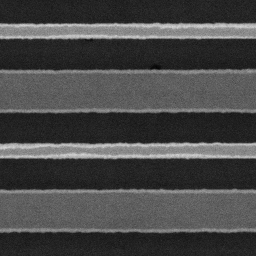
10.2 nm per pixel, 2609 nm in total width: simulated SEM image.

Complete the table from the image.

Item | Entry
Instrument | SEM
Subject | lines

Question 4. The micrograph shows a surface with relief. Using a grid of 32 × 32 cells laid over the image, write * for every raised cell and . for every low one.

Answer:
................................
................................
................................
********************************
********************************
................................
................................
................................
................................
********************************
********************************
********************************
********************************
********************************
................................
................................
................................
................................
********************************
********************************
................................
................................
................................
................................
********************************
********************************
********************************
********************************
********************************
................................
................................
................................